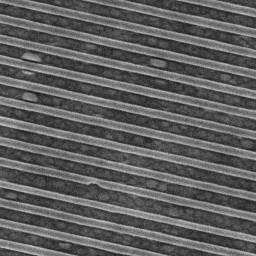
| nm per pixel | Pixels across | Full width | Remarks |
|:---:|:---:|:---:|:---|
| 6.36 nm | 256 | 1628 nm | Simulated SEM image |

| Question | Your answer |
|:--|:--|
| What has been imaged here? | parallel lines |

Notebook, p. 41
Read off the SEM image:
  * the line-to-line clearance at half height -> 76.9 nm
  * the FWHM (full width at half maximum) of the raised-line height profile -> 49.7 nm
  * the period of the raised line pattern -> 127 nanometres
